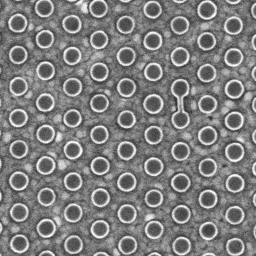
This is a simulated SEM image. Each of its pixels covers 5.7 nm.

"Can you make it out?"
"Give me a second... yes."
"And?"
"a regular array of raised bodies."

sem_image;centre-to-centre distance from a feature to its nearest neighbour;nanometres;176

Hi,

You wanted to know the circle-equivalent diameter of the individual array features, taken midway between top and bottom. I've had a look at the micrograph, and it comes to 99.6 nanometers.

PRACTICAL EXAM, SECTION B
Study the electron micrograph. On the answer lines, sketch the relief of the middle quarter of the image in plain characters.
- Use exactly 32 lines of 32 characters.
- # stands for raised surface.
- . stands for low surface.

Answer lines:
.......###...........###........
.......####.........####........
.......####.........####........
.......###...........###........
####..........###...........###.
####..........####.........####.
####..........####.........####.
.###..........###..........####.
.......####..........###....##..
.......####.........#####...##..
.......####.........#####...##..
..#.....##...........###.....#..
####..........###...........###.
####..........####.........####.
####..........####.........####.
.##...........###...........##..
.......####..........###........
.......####.........####........
.......####.........####........
........##...........###........
####..........###...........###.
####..........####.........####.
####..........####.........####.
.##.....#.....###.....#.....###.
.......####..........###........
.......####.........#####.......
.......####.........#####.......
.##.....#......##....###........
####..........####.........####.
####.........#####.........####.
.###..........####.........####.
..#.....##.....##...........##..